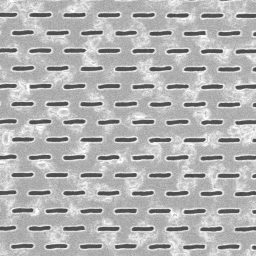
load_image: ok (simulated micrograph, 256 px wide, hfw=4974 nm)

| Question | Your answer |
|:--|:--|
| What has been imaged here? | a regular array of holes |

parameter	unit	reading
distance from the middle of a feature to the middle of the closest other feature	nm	473